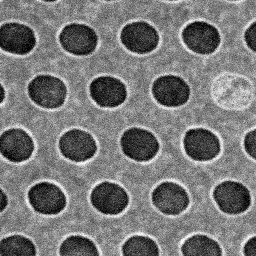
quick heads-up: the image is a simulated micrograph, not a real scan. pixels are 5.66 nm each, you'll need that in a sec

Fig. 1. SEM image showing a regular array of holes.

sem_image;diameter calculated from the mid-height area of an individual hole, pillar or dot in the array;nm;210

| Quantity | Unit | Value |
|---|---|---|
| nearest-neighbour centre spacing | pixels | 60.9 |